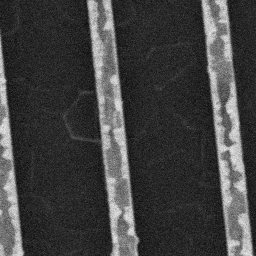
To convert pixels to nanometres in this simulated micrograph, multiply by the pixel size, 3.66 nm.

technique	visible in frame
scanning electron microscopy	one or a few lines or trenches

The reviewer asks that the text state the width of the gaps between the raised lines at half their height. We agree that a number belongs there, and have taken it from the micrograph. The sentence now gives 0.337 microns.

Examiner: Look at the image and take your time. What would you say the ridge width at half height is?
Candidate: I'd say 81.1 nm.